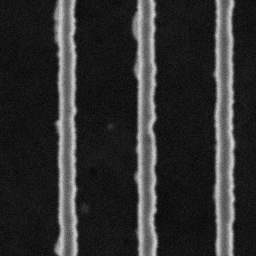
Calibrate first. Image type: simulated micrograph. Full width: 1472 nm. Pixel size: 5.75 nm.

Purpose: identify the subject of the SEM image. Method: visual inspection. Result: lines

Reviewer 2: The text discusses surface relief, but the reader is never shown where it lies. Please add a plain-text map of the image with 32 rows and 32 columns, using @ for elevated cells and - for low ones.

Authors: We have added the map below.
-------@@--------@@--------@@---
-------@@--------@@--------@@---
-------@@--------@@--------@@---
-------@@--------@@--------@@---
-------@@--------@@--------@@---
-------@@--------@@--------@@---
-------@@--------@@--------@@---
-------@@--------@@--------@@---
-------@@--------@@--------@@---
-------@@--------@@--------@@---
-------@@--------@@--------@@---
-------@@--------@@--------@@---
-------@@--------@@--------@@---
-------@@--------@@--------@@---
-------@@--------@@--------@@---
-------@@--------@@--------@@---
-------@@--------@@--------@@---
-------@@--------@@--------@@---
-------@@--------@@--------@@---
-------@@--------@@--------@@---
-------@@--------@@--------@@---
-------@@--------@@--------@@---
-------@@--------@@--------@@---
-------@@--------@@--------@@---
-------@@--------@@--------@@---
-------@@--------@@--------@@---
-------@@--------@@--------@@---
-------@@@-------@@--------@@---
-------@@--------@@--------@@---
-------@@@-------@@--------@@---
--------@@-------@@@-------@@---
-------@@@-------@@--------@@---